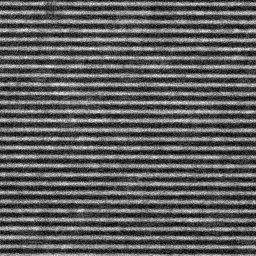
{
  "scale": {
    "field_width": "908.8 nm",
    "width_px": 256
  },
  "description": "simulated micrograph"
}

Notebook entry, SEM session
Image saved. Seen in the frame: parallel lines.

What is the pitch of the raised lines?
32 nanometers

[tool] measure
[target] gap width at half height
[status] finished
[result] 0.0231 µm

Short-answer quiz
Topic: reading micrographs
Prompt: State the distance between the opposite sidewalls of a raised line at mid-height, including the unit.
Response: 0.0089 microns